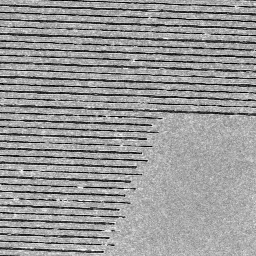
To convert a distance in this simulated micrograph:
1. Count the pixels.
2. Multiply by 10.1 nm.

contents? parallel lines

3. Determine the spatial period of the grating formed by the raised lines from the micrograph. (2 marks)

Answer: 71.7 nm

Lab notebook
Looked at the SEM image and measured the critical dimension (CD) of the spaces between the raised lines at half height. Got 2.25 pixels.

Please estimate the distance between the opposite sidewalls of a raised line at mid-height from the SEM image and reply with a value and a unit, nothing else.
51.5 nanometers